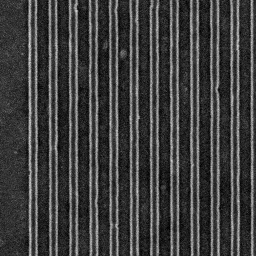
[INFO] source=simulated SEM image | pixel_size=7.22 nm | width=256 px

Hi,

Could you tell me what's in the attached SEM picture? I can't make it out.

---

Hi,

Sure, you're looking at parallel lines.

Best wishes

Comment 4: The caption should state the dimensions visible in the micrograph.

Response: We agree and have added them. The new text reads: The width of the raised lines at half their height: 48.8 nanometres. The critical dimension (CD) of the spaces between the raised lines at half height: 98.4 nanometers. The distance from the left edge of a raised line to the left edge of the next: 0.146 µm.